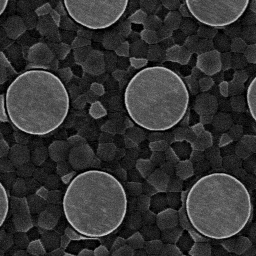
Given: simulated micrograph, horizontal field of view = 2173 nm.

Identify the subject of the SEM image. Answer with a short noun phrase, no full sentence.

raised bodies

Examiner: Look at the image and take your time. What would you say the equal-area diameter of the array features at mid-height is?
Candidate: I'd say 536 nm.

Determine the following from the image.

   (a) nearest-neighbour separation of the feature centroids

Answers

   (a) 1000 nm